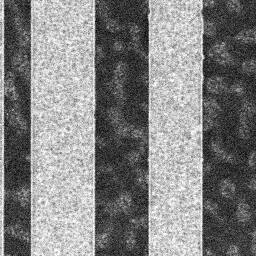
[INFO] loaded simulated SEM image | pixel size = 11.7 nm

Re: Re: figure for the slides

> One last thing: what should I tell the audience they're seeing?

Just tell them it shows one or a few lines or trenches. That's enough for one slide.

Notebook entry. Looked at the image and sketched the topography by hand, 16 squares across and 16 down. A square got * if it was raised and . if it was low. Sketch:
..****...****...
..****...****...
..****...****...
..****...****...
..****...****...
..****...****...
..****...****...
..****...****...
..****...****...
..****...****...
..****...****...
..****...****...
..****...****...
..****...****...
..****...****...
..****...****...